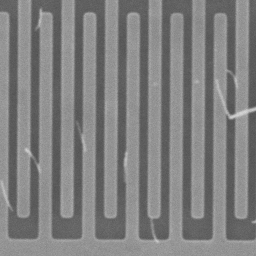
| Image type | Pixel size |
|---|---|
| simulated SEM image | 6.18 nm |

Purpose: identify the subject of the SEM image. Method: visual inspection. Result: groups of lines, slits or small figures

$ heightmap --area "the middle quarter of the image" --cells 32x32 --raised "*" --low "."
**...***..***...***..***...***..
**...***..***...***..***...***..
**...***..***...***..***...***..
**...***..***...***..***...***..
**...***..***...***..***...***..
**...***..***...***..***...***..
**...***..***...***..***...***..
**...***..***...***..***...***..
**...***..***...***..***...***..
**...***..***...***..***...***..
**...***..***...***..***...***..
**...***..***...***..***...***..
**...***..***...***..***...***..
**...***..***...***..***...***..
**...***..***...***..***...**...
**...***..***...***..***...**...
**...***..***...***..***...**...
**...***..***...***..***...**...
**..****..***...***..***...**...
**...***..***...***..***...**...
**...***..***...***..***...**...
**...***..***...***..***...**...
**...***..***..****..***...**...
**...***..***..****..***...**...
**...***..***..****..***...**...
**...***..***..****..***...**...
**...***..***..****..***...**...
**...***..***...***..***...**...
**...***..***...***..***...**...
**...***..***...***..***...**...
**...***..***...***..***...**...
**...***..***...***..***...**...